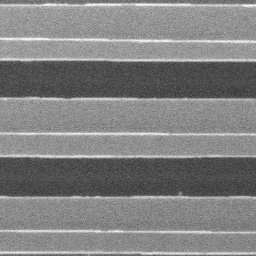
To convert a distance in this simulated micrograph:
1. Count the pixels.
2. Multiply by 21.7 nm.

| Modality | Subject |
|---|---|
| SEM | lines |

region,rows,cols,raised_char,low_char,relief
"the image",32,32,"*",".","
................................
********************************
********************************
********************************
********************************
********************************
********************************
.................***************
................................
................................
................................
................................
********************************
********************************
********************************
********************************
********************************
********************************
********************************
********************************
................................
................................
................................
................................
................................
********************************
********************************
********************************
********************************
********************************
********************************
...*****************************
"